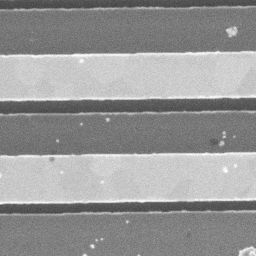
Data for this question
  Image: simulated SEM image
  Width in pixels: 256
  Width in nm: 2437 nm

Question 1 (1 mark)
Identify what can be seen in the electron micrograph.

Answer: lines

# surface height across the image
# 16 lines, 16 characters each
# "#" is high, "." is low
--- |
................
................
................
################
################
################
................
................
................
................
################
################
################
................
................
................